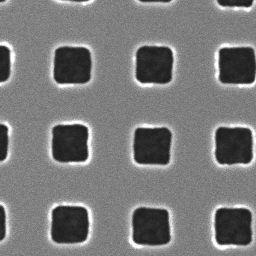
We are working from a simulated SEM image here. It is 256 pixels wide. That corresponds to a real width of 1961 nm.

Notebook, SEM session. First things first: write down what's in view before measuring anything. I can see a regular array of holes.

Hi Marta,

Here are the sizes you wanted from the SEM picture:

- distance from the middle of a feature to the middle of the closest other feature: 620 nanometers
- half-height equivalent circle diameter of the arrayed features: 41.4 px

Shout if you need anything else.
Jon